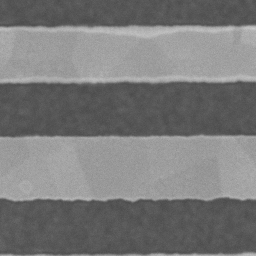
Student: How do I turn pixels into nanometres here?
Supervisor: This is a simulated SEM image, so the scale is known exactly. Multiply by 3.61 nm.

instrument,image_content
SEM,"lines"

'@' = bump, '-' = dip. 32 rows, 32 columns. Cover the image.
--------------------------------
--------------------------------
--------------------------------
@@@@@@-@@@@-@--------@@@@@@@@@@@
@@@@@@@@@@@@@@@@@@@@@@@@@@@@@@@@
@@@@@@@@@@@@@@@@@@@@@@@@@@@@@@@@
@@@@@@@@@@@@@@@@@@@@@@@@@@@@@@@@
@@@@@@@@@@@@@@@@@@@@@@@@@@@@@@@@
@@@@@@@@@@@@@@@@@@@@@@@@@@@@@@@@
@@@@@@@@@@@@@@@@@@@@@@@@@@@@@@@@
--------------------------------
--------------------------------
--------------------------------
--------------------------------
--------------------------------
--------------------------------
--------------------------------
@@@@@@@@@@@@@@@@@@@@@@@@@@@@@@@@
@@@@@@@@@@@@@@@@@@@@@@@@@@@@@@@@
@@@@@@@@@@@@@@@@@@@@@@@@@@@@@@@@
@@@@@@@@@@@@@@@@@@@@@@@@@@@@@@@@
@@@@@@@@@@@@@@@@@@@@@@@@@@@@@@@@
@@@@@@@@@@@@@@@@@@@@@@@@@@@@@@@@
@@@@@@@@@@@@@@@@@@@@@@@@@@@@@@@@
@@@@@@@@@@@@@@@@@@@@@@@@@@@@@@@@
--------------------------------
--------------------------------
--------------------------------
--------------------------------
--------------------------------
--------------------------------
--------------------------------